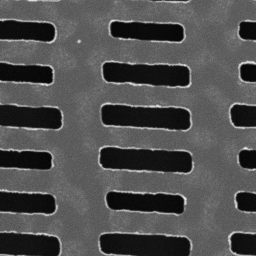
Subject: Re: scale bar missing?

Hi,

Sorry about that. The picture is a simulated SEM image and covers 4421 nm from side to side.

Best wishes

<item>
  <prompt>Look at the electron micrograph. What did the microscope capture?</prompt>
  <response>holes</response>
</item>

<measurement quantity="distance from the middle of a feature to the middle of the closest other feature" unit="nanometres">737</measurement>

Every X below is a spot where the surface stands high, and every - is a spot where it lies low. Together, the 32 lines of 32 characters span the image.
XXXXXXXXXXXXXXXXXXXXXXXXXXXXXXXX
XXXXXXXXXXXXXXXXXXXXXXXXXXXXXXXX
XXXXXXXXXXXXXXXXXXXXXXXXXXXXXXXX
-------XXXXXXX---------XXXXXXX--
-------XXXXXXX---------XXXXXXX--
XXXXXXXXXXXXXXXXXXXXXXXXXXXXXXXX
XXXXXXXXXXXXXXXXXXXXXXXXXXXXXXXX
XXXXXXXXXXXXXXXXXXXXXXXXXXXXXXXX
------XXXXXXX----------XXXXXXX--
-------XXXXXX-----------XXXXXX--
XXXXXXXXXXXXXXXXXX-----XXXXXXXXX
XXXXXXXXXXXXXXXXXXXXXXXXXXXXXXXX
XXXXXXXXXXXXXXXXXXXXXXXXXXXXXXXX
-------XXXXXX---------XXXXXXX---
--------XXXXX-----------XXXXX---
--------XXXXX-----------XXXXX---
XXXXXXXXXXXXXXXXXXXXXXXXXXXXXXXX
XXXXXXXXXXXXXXXXXXXXXXXXXXXXXXXX
XXXXXXXXXXXXX--XXXXXXXXXXXXXXXXX
------XXXXXX------------XXXXXX--
------XXXXXXX-----------XXXXXX--
XXXXXXXXXXXXXXXXXXXX----XXXXXXXX
XXXXXXXXXXXXXXXXXXXXXXXXXXXXXXXX
XXXXXXXXXXXXXXXXXXXXXXXXXXXXXXXX
-------XXXXXX----------XXXXXXX--
-------XXXXXX----------XXXXXXX--
-------XXXXXXXXXXXXX---XXXXXXXX-
XXXXXXXXXXXXXXXXXXXXXXXXXXXXXXXX
XXXXXXXXXXXXXXXXXXXXXXXXXXXXXXXX
------XXXXXXX---------XXXXXXX---
--------XXXX------------XXXXX---
-------XXXXXX-----------XXXXX---